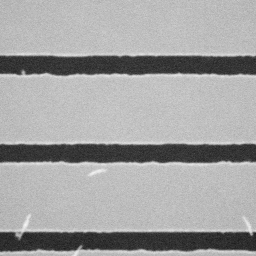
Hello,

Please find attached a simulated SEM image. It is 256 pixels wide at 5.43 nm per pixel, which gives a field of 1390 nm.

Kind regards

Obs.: lines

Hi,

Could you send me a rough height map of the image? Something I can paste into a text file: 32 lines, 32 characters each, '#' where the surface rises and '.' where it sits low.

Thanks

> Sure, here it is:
################################
################################
################################
################################
################################
################################
################################
................................
................................
#######.########################
################################
################################
################################
################################
################################
################################
################################
################################
................................
................................
################################
################################
################################
################################
################################
################################
################################
################################
################################
................................
................................
################################